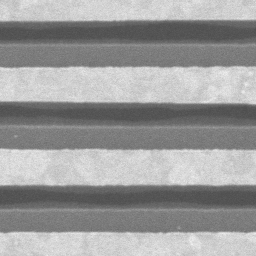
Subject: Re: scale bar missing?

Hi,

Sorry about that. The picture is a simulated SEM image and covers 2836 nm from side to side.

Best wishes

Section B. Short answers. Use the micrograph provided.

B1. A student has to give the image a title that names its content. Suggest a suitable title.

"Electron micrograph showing lines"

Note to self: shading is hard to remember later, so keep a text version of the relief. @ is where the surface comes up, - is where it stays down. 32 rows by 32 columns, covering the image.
@@@@@@@@@@@@@@@@@@@@@@@@@@@@@@@@
@@@@@@@@@@@@@@@@@@@@@@@@@@@@@@@@
@@@@@@@@@@@@@@@@@@@@@@@@@@@@@@@@
--------------------------------
--------------------------------
@@@@@@@@@@@@@@@@@@@@@@@@@@@@@@@@
@@@@@@@@@@@@@@@@@@@@@@@@@@@@@@@@
@@@@@@@@@@@@@@@@@@@@@@@@@@@@@@@@
@@@@@@@@@@@@@@@@@@@@@@@@@@@@@@@@
@@@@@@@@@@@@@@@@@@@@@@@@@@@@@@@@
@@@@@@@@@@@@@@@@@@@@@@@@@@@@@@@@
@@@@@@@@@@@@@@@@@@@@@@@@@@@@@@@@
@@@@@@@@@@@@@@@@@@@@@@@@@@@@@@@@
--------------------------------
--------------------------------
--------------------------------
@@@@@@@@@@@@@@@@@@@@@@@@@@@@@@@@
@@@@@@@@@@@@@@@@@@@@@@@@@@@@@@@@
@@@@@@@@@@@@@@@@@@@@@@@@@@@@@@@@
@@@@@@@@@@@@@@@@@@@@@@@@@@@@@@@@
@@@@@@@@@@@@@@@@@@@@@@@@@@@@@@@@
@@@@@@@@@@@@@@@@@@@@@@@@@@@@@@@@
@@@@@@@@@@@@@@@@@@@@@@@@@@@@@@@@
--------------------------------
--------------------------------
--------------------------------
@@@@@@@@@@@@@@@@@@@@@@@@@@@@@@@@
@@@@@@@@@@@@@@@@@@@@@@@@@@@@@@@@
@@@@@@@@@@@@@@@@@@@@@@@@@@@@@@@@
@@@@@@@@@@@@@@@@@@@@@@@@@@@@@@@@
@@@@@@@@@@@@@@@@@@@@@@@@@@@@@@@@
@@@@@@@@@@@@@@@@@@@@@@@@@@@@@@@@